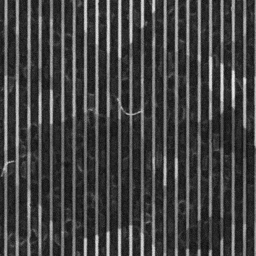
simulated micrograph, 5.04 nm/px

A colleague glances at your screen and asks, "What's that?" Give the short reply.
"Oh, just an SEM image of parallel lines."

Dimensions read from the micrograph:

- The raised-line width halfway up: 0.0101 micrometres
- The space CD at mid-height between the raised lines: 48.5 nm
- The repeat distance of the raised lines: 0.0573 microns